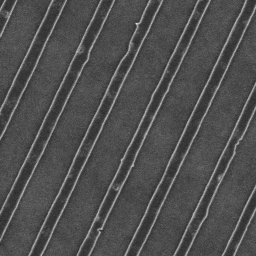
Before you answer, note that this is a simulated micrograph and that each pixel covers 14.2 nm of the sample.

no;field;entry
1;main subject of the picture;parallel lines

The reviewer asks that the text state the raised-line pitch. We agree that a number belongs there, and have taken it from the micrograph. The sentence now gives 621 nm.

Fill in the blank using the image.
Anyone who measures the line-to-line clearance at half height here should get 0.463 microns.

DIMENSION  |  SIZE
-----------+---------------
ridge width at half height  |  169 nm